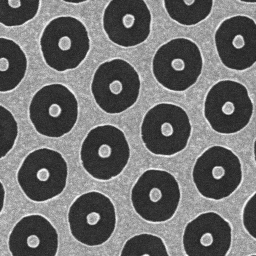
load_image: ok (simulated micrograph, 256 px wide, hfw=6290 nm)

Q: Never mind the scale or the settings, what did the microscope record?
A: a regular array of ring-shaped grooves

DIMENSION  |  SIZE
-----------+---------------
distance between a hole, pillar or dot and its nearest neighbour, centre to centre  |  1.61 micrometres